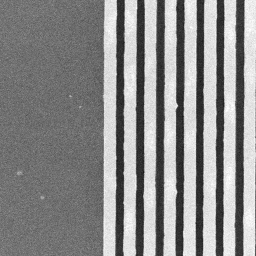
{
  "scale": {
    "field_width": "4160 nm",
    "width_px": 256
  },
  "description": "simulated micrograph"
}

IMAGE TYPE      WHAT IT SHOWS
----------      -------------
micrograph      parallel lines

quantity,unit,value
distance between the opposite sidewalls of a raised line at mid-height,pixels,11.5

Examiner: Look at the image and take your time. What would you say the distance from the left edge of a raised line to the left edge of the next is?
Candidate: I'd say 324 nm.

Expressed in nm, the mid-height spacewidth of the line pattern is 126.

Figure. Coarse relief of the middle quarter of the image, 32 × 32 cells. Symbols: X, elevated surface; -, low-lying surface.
----------XXX--XXX--XXX--XXX--XX
----------XXX--XXX--XXX--XXX--XX
----------XXX--XXX--XXX--XXX--XX
----------XXX--XXX--XXX--XXX--XX
----------XXX--XXX--XXX--XXX--XX
----------XXX--XXX--XXX--XXX--XX
----------XXX--XXX--XXX--XXX--XX
----------XXX--XXX--XXX--XXX--XX
----------XXX--XXX--XXX--XXX--XX
----------XXX--XXX--XXX--XXX--XX
----------XXX--XXX--XXX--XXX--XX
----------XXX--XXX--XXX--XXX--XX
----------XXX--XXX--XXX--XXX--XX
----------XXX--XXX--XXX--XXX--XX
----------XXX--XXX--XXX--XXX--XX
----------XXX--XXX--XXX--XXX--XX
----------XXX--XXX--XXX--XXX--XX
----------XXX--XXX--XXX--XXX--XX
----------XXX--XXX--XXX--XXX--XX
----------XXX--XXX--XXX--XXX--XX
----------XXX--XXX--XXX--XXX--XX
----------XXX--XXX--XXX--XXX--XX
----------XXX--XXX--XXX--XXX--XX
----------XXX--XXX--XXX--XXX--XX
----------XXX--XXX--XXX--XXX--XX
----------XXX--XXX--XXX--XXX--XX
----------XXX--XXX--XXX--XXX--XX
----------XXX--XXX--XXX--XXX--XX
----------XXX--XXX--XXX--XXX--XX
----------XXX--XXX--XXX--XXX--XX
----------XXX--XXX--XXX--XXX--XX
----------XXX--XXX--XXX--XXX--XX